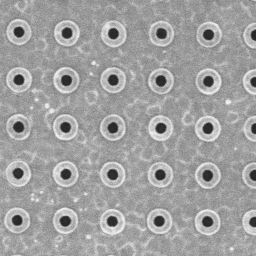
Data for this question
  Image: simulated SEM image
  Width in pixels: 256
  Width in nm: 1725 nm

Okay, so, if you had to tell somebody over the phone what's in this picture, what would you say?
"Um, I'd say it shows a regular array of ring-shaped raised bodies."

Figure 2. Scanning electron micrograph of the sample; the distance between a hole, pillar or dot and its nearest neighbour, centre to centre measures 316 nanometers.